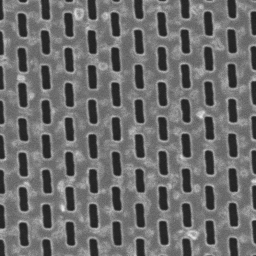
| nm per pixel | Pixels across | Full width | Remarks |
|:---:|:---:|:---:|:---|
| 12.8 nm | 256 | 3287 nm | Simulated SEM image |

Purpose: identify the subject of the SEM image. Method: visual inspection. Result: a regular array of holes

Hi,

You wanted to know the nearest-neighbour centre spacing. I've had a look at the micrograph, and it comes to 0.371 micrometres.